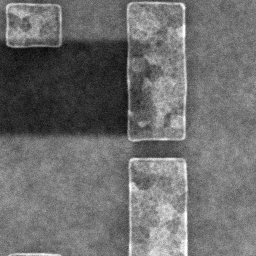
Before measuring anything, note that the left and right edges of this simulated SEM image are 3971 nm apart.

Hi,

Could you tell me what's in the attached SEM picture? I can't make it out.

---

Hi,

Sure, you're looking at wiring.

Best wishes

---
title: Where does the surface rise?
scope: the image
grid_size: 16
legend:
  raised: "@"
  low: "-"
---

-@@@----@@@-----
@@@@----@@@-----
@@@@----@@@-----
--------@@@@----
--------@@@@----
--------@@@@----
--------@@@@----
--------@@@@----
--------@@@-----
----------------
--------@@@@----
--------@@@@----
--------@@@@----
--------@@@@----
--------@@@@----
--------@@@@----